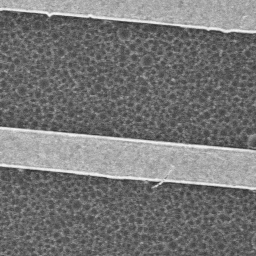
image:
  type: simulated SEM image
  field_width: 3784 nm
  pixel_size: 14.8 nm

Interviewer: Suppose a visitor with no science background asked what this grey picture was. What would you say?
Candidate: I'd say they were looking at one or a few lines or trenches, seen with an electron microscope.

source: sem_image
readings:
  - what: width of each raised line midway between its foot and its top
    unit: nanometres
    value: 550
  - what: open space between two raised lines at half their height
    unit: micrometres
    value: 1.76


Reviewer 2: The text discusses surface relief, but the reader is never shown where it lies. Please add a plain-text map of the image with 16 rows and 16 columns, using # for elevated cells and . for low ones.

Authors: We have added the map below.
################
..........######
................
................
................
................
................
................
#####...........
################
..##############
.............###
................
................
................
................